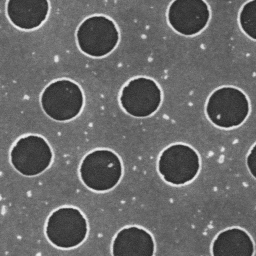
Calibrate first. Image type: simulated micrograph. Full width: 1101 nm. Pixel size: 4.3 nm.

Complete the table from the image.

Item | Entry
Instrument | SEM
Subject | a regular array of holes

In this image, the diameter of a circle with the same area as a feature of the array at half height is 0.176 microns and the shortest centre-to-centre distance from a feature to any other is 0.301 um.